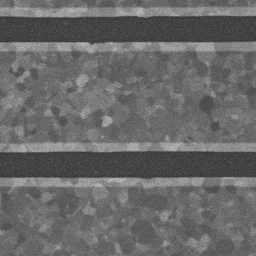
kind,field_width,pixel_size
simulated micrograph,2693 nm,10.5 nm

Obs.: one or a few lines or trenches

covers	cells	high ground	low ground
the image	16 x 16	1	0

1111111111111111
0000000000000000
0000000000000000
1111111111111111
1111111111111111
1111111111111111
1111111111111111
1111111111111111
1111111111111111
0000000000000000
0000000000000000
1111111111111111
1111111111111111
1111111111111111
1111111111111111
1111111111111111